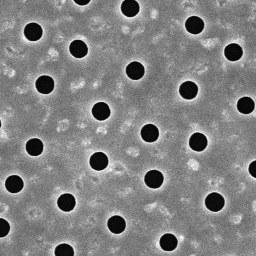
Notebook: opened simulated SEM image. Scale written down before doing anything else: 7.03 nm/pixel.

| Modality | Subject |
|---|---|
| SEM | a regular array of holes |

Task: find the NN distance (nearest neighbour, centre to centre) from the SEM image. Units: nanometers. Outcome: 346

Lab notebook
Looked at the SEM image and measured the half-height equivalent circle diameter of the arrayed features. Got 132 nm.